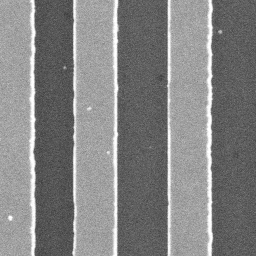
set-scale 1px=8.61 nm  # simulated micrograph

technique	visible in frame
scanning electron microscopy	lines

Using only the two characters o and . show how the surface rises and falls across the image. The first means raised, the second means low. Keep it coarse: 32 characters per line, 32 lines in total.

oooo.....oooooo......ooooo......
oooo.....oooooo......ooooo......
oooo.....oooooo......ooooo......
oooo.....oooooo......ooooo......
oooo.....oooooo......ooooo......
oooo.....oooooo......ooooo......
oooo.....oooooo......ooooo......
oooo.....oooooo......ooooo......
oooo.....oooooo......ooooo......
oooo.....oooooo......ooooo......
oooo.....oooooo......ooooo......
oooo.....oooooo......ooooo......
oooo.....oooooo......ooooo......
oooo.....oooooo......ooooo......
oooo.....oooooo......ooooo......
oooo.....oooooo......ooooo......
oooo.....oooooo......ooooo......
oooo.....oooooo......ooooo......
oooo.....oooooo......ooooo......
oooo.....oooooo......ooooo......
oooo.....oooooo......ooooo......
oooo.....oooooo......ooooo......
oooo.....oooooo......ooooo......
oooo.....oooooo......ooooo......
oooo.....oooooo......ooooo......
oooo.....oooooo......ooooo......
oooo.....oooooo......ooooo......
oooo.....oooooo......ooooo......
oooo.....oooooo......ooooo......
oooo.....oooooo......ooooo......
oooo.....oooooo......ooooo......
oooo.....oooooo......ooooo......